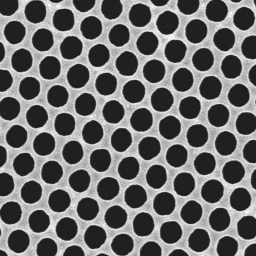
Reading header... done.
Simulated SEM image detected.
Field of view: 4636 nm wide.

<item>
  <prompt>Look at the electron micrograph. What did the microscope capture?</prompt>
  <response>a regular array of holes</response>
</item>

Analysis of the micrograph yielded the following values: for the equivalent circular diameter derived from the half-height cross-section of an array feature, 0.416 microns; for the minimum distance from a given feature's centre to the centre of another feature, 28.6 px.